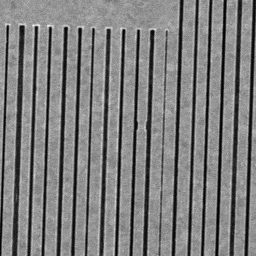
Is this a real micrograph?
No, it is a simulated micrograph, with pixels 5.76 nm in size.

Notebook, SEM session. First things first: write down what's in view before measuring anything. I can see parallel lines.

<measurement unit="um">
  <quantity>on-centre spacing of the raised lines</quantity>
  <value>0.0836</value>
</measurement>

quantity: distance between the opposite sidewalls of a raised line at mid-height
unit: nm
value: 58.3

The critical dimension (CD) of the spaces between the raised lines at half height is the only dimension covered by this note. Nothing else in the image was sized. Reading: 23.8 nm